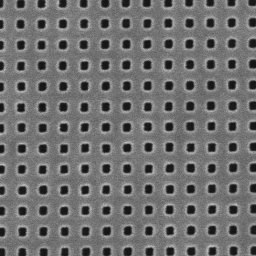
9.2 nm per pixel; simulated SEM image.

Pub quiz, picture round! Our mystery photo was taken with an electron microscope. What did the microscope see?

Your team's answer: a regular array of holes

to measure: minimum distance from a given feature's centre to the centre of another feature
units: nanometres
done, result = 189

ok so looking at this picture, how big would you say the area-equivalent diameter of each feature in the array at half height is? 0.0862 microns